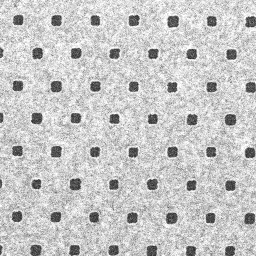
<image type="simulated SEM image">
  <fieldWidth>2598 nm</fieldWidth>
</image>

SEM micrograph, a regular array of holes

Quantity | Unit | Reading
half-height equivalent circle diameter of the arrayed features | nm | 121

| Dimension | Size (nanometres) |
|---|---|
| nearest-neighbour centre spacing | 383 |